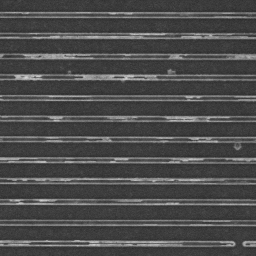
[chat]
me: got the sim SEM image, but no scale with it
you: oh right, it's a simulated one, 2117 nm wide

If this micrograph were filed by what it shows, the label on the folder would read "parallel lines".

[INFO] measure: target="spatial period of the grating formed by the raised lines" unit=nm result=172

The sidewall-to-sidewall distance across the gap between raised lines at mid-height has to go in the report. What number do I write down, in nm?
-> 132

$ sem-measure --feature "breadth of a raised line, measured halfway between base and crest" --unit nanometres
39.3